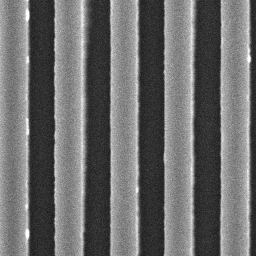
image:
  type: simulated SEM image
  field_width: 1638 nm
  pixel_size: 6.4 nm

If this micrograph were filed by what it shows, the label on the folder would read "lines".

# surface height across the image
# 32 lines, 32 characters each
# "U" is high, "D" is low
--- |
UUUDDDDUUUDDDDUUUDDDDUUUDDDDUUUD
UUUUDDDUUUDDDDUUUDDDDUUUDDDDUUUD
UUUUDDDUUUDDDDUUUDDDDUUUDDDDUUUD
UUUDDDDUUUDDDDUUUDDDDUUUDDDDUUUD
UUUDDDDUUUDDDDUUUDDDDUUUDDDDUUUD
UUUDDDDUUUDDDDUUUDDDDUUUDDDDUUUD
UUUDDDDUUUDDDDUUUDDDDUUUDDDDUUUD
UUUUDDDUUUDDDDUUUDDDDUUUDDDDUUUD
UUUDDDDUUUDDDDUUUDDDDUUUDDDDUUUD
UUUDDDDUUUDDDDUUUDDDDUUUDDDDUUUD
UUUDDDDUUUDDDDUUUDDDDUUUDDDDUUUD
UUUDDDDUUUDDDDUUUDDDDUUUDDDDUUUD
UUUDDDDUUUDDDDUUUDDDDUUUDDDDUUUD
UUUDDDDUUUDDDDUUUDDDDUUUDDDDUUUD
UUUDDDDUUUDDDDUUUDDDDUUUDDDDUUUD
UUUDDDDUUUDDDDUUUDDDDUUUDDDDUUUD
UUUUDDDUUUDDDDUUUDDDDUUUDDDDUUUD
UUUDDDDUUUDDDDUUUDDDDUUUDDDDUUUD
UUUDDDDUUUDDDDUUUDDDDUUUDDDDUUUD
UUUDDDDUUUDDDDUUUDDDDUUUDDDDUUUD
UUUDDDDUUUDDDDUUUDDDDUUUDDDDUUUD
UUUDDDDUUUDDDDUUUDDDDUUUDDDDUUUD
UUUDDDDUUUDDDDUUUDDDDUUUDDDDUUUD
UUUDDDDUUUDDDDUUUDDDDUUUDDDDUUUD
UUUDDDDUUUDDDDUUUDDDDUUUDDDDUUUD
UUUDDDDUUUDDDDUUUDDDDUUUDDDDUUUD
UUUDDDDUUUDDDDUUUDDDDUUUDDDDUUUD
UUUDDDDUUUDDDDUUUDDDDUUUDDDDUUUD
UUUDDDDUUUDDDDUUUDDDDUUUDDDDUUUD
UUUUDDDUUUDDDDUUUDDDDUUUDDDDUUUD
UUUDDDDUUUDDDDUUUDDDDUUUDDDDUUUD
UUUDDDDUUUDDDDUUUDDDDUUUDDDDUUUD